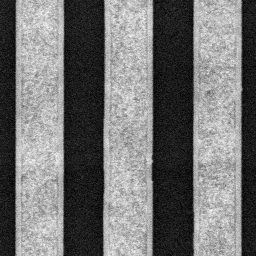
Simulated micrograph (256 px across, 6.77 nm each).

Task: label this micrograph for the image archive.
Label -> one or a few lines or trenches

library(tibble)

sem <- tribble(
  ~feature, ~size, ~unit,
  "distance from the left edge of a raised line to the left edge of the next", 0.602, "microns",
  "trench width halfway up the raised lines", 314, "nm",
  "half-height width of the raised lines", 0.288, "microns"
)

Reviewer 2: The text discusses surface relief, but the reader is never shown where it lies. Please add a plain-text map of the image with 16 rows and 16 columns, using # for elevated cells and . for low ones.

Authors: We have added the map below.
.###...##...###.
.###...##...###.
.###...##...###.
.###...##...###.
.###...##...###.
.###...##...###.
.###...##...###.
.###...##...###.
.###...##...###.
.###...##...###.
.###...##...###.
.###...##...###.
.###...##...###.
.###...##...###.
.###...##...###.
.###...##...###.